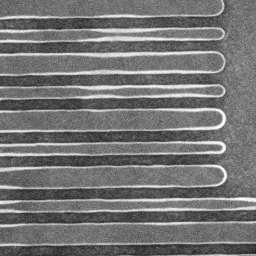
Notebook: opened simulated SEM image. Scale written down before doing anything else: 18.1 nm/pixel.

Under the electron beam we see groups of lines, slits or small figures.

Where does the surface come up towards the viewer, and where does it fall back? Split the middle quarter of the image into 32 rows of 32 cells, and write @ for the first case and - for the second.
@@@@@@@@@@@@@@@@@@@@@@@@@@@@@@@@
@@@@@@@@@@@@@@@@@@@@@@@@@@@@@@@@
--------------------------------
--------------------------------
--------------------------------
--------------------------------
@@@@@@@@@@@@@@@@@@@@@@@@@@@@@@@@
@@@@@@@@@@@@@@@@@@@@@@@@@@@@@@@@
@@------------------------------
--------------------------------
--------------------------------
----@@------@@@@@@@@@@@@@@@@@---
@@@@@@@@@@@@@@@@@@@@@@@@@@@@@@@@
@@@@@@@@@@@@@@@@@@@@@@@@@@@@@@@@
@@@@@@@@@@@@@@@@@@@@@@@@@@@@@@@@
@@@@@@@@@@@@@@@@@@@@@@@@@@@@@@@@
@@@@@@@@@@@@@@-------@@---------
--------------------------------
--------------------------------
--------------------------------
@@@@@@@@@@@@@@@@@@@@@@@@@@@@@@@@
@@@@@@@@@@@@@@@@@@@@@@@@@@@@@@@@
@@-@@@@@@@@---------------------
--------------------------------
--------------------------------
-------------------------------@
@@@@@@@@@@@@@@@@@@@@@@@@@@@@@@@@
@@@@@@@@@@@@@@@@@@@@@@@@@@@@@@@@
@@@@@@@@@@@@@@@@@@@@@@@@@@@@@@@@
@@@@@@@@@@@@@@@@@@@@@@@@@@@@@@@@
@@@@@@@@@@@@@@@@@@@@@@@@@@@@@@@@
--------------------------------